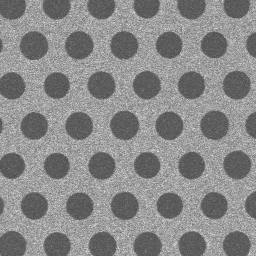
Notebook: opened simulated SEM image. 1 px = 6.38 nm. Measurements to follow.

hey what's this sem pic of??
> a regular array of holes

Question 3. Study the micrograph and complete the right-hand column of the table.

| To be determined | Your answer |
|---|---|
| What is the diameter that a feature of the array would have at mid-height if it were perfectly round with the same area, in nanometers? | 174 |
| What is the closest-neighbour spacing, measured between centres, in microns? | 0.286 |